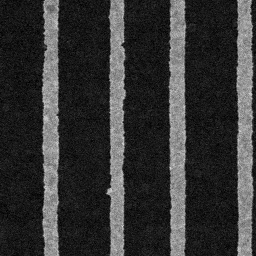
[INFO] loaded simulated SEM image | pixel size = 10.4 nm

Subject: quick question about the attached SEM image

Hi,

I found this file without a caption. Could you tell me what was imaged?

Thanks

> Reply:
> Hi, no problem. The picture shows one or a few lines or trenches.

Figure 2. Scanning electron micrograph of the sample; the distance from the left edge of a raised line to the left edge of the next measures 64.7 pixels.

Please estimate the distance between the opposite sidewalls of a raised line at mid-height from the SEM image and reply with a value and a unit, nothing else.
0.143 microns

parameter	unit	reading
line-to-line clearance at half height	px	52.1